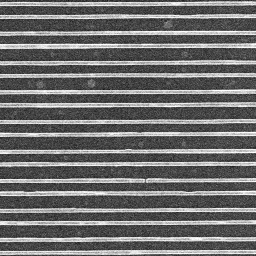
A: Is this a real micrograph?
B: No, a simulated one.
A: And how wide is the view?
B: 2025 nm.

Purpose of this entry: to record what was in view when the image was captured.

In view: parallel lines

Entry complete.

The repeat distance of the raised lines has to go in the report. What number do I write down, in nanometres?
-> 116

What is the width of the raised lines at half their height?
26.7 nm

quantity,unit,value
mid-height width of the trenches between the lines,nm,78.1